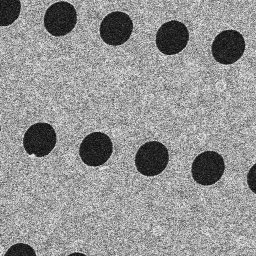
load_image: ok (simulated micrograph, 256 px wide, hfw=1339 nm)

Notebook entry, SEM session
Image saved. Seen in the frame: a regular array of holes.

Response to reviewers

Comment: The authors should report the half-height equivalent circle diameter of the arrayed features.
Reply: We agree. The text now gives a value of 178 nm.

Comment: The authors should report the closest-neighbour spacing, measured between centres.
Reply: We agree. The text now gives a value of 297 nm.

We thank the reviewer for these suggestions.